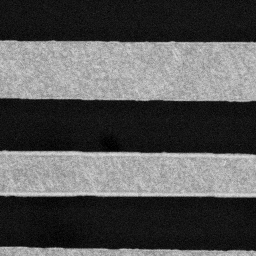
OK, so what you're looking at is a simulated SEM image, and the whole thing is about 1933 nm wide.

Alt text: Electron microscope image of lines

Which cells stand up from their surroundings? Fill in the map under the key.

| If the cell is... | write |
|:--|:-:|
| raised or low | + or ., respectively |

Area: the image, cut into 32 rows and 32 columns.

................................
................................
................................
................................
................................
++++++++++++++++++++++++++++++++
++++++++++++++++++++++++++++++++
++++++++++++++++++++++++++++++++
++++++++++++++++++++++++++++++++
++++++++++++++++++++++++++++++++
++++++++++++++++++++++++++++++++
++++++++++++++++++++++++++++++++
.................++.++++++++++++
................................
................................
................................
................................
................................
................................
++++++++++++++++++++++++++++++++
++++++++++++++++++++++++++++++++
++++++++++++++++++++++++++++++++
++++++++++++++++++++++++++++++++
++++++++++++++++++++++++++++++++
................................
................................
................................
................................
................................
................................
................................
++++++++++++++++++++++++++++++++